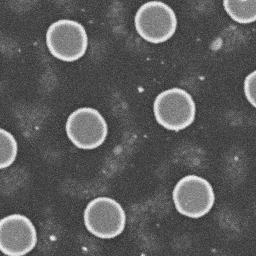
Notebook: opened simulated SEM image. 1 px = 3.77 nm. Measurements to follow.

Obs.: raised bodies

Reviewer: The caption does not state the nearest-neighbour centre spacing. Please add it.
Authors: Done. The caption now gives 338 nm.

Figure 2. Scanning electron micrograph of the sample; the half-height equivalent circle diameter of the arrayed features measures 144 nm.